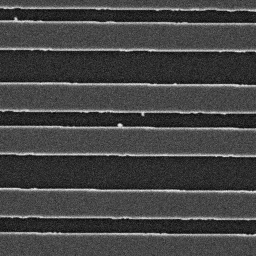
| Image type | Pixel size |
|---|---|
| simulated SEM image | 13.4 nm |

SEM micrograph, lines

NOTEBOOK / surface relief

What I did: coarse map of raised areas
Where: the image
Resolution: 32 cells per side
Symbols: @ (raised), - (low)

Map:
@@@@@@@@@@@@@@@@@@@@@@@@@@@@@@@@
--------------------------------
--------------------------------
@@@@@@@@@@@@@@@@@@@@@@@@@@@@@@@@
@@@@@@@@@@@@@@@@@@@@@@@@@@@@@@@@
@@@@@@@@@@@@@@@@@@@@@@@@@@@@@@@@
--------------------------------
--------------------------------
--------------------------------
--------------------------------
@@@@@@@@@@----------------------
@@@@@@@@@@@@@@@@@@@@@@@@@@@@@@@@
@@@@@@@@@@@@@@@@@@@@@@@@@@@@@@@@
@@@@@@@@@@@@@@@@@@@@@@@@@@@@@@@@
--------------------------------
--------------------------------
@@@@@@@@@@@@@@@@@@@@@@@@@@@@@@@@
@@@@@@@@@@@@@@@@@@@@@@@@@@@@@@@@
@@@@@@@@@@@@@@@@@@@@@@@@@@@@@@@@
--------------------------@@@@@@
--------------------------------
--------------------------------
--------------------------------
--------------------------------
@@@@@@@@@@@@@@@@@@@@@@@@@@@@@@@@
@@@@@@@@@@@@@@@@@@@@@@@@@@@@@@@@
@@@@@@@@@@@@@@@@@@@@@@@@@@@@@@@@
--------------------------------
--------------------------------
@@@@@@@@@@@@@@@@@@@@@@@@@@@@@@@@
@@@@@@@@@@@@@@@@@@@@@@@@@@@@@@@@
@@@@@@@@@@@@@@@@@@@@@@@@@@@@@@@@